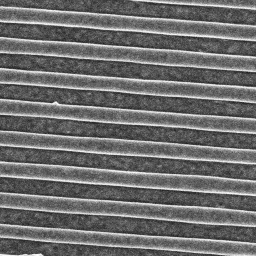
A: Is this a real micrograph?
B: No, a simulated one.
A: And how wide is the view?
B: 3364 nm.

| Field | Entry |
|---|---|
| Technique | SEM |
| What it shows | parallel lines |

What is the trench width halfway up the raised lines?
16.4 pixels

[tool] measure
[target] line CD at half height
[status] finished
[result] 0.192 µm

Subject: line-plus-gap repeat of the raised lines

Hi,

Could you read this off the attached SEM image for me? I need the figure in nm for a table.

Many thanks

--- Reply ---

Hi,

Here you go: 406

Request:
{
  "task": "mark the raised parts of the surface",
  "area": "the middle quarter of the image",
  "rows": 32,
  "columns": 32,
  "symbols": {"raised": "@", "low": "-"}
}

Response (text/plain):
------------------------------@@
--------------------------------
--------------------------------
@@@@@@@@@@@@@-------------------
@@@@@@@@@@@@@@@@@@@@@@@@@@@@@---
@@@@@@@@@@@@@@@@@@@@@@@@@@@@@@@@
----------@@@@@@@@@@@@@@@@@@@@@@
--------------------@@@@@@@@@@@@
--------------------------------
--------------------------------
@@--@---------------------------
@@@@@@@@@@@@@@@-----------------
@@@@@@@@@@@@@@@@@@@@@@@@@@@@----
@@@@@@@@@@@@@@@@@@@@@@@@@@@@@@@@
---------@@@@@@@@@@@@@@@@@@@@@@@
-------------------------@@@@@@@
--------------------------------
--------------------------------
@@@@@@@@------------------------
@@@@@@@@@@@@@@@@@@@@@-----------
@@@@@@@@@@@@@@@@@@@@@@@@@@@@@@@@
-@@@@@@@@@@@@@@@@@@@@@@@@@@@@@@@
-----------@@@@@@@@@@@@@@@@@@@@@
----------------------------@@@@
--------------------------------
--------------------------------
@@@@@@@@@@----------------------
@@@@@@@@@@@@@@@@@@@@@@@---------
@@@@@@@@@@@@@@@@@@@@@@@@@@@@@@@@
----@@@@@@@@@@@@@@@@@@@@@@@@@@@@
-----------------@@@@@@@@@@@@@@@
------------------------------@@